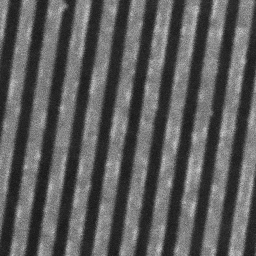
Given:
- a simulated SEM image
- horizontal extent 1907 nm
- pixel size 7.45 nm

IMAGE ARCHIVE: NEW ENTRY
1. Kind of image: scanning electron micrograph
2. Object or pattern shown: parallel lines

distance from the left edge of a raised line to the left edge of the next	201	nanometres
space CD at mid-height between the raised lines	101	nm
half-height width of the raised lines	100	nm